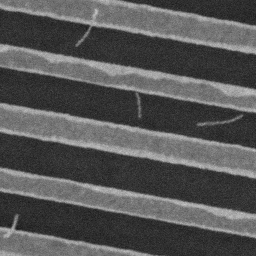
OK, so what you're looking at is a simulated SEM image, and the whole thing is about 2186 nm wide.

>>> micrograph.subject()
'lines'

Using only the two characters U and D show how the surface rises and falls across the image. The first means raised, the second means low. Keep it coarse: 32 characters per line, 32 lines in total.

UUUUUUUUUUUUUUUUUDDDDDDDDDDDDDDD
DDDUUUUUUUUUUUUUUUUUUUDDDDDDDDDD
DDDDDDDDUUUUUUUUUUUUUUUUUUUUDDDD
DDDDDDDDDDDDDDUUUUUUUUUUUUUUUUUU
DDDDDDDDDDDDDDDDDDDUUUUUUUUUUUUU
DDDDDDDDDDDDDDDDDDDDDDDDDUUUUUUU
UUUUDDDDDDDDDDDDDDDDDDDDDDDDDDDU
UUUUUUUUUDDDDDDDDDDDDDDDDDDDDDDD
DUUUUUUUUUUUUUDDDDDDDDDDDDDDDDDD
DDDDDDDUUUUUUUUUUUUUUDDDDDDDDDDD
DDDDDDDDDDDDUUUUUUUUUUUUUUUDDDDD
DDDDDDDDDDDDDDDDDUUUUUUUUUUUUUUU
DDDDDDDDDDDDDDDDDDDDDDDUUUUUUUUU
UUUDDDDDDDDDDDDDDDDDDDDDDDDDDUUU
UUUUUUUUUDDDDDDDDDDDDDDDDDDDDDDD
UUUUUUUUUUUUUUDDDDDDDDDDDDDDDDDD
UUUUUUUUUUUUUUUUUUUUDDDDDDDDDDDD
DDDDDDUUUUUUUUUUUUUUUUUUUDDDDDDD
DDDDDDDDDDDDUUUUUUUUUUUUUUUUUUUD
DDDDDDDDDDDDDDDDDUUUUUUUUUUUUUUU
DDDDDDDDDDDDDDDDDDDDDDDUUUUUUUUU
UUDDDDDDDDDDDDDDDDDDDDDDDDDDUUUU
UUUUUUUUDDDDDDDDDDDDDDDDDDDDDDDD
UUUUUUUUUUUUDDDDDDDDDDDDDDDDDDDD
DDDDUUUUUUUUUUUUUUUDDDDDDDDDDDDD
DDDDDDDDDUUUUUUUUUUUUUUUDDDDDDDD
DDDDDDDDDDDDDDUUUUUUUUUUUUUUDDDD
DDDDDDDDDDDDDDDDDDDDUUUUUUUUUUUU
DUDDDDDDDDDDDDDDDDDDDDDDDUUUUUUU
UUUUUUDDDDDDDDDDDDDDDDDDDDDDDDDU
UUUUUUUUUUUDDDDDDDDDDDDDDDDDDDDD
UUUUUUUUUUUUUUUUUDDDDDDDDDDDDDDD